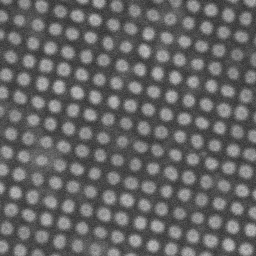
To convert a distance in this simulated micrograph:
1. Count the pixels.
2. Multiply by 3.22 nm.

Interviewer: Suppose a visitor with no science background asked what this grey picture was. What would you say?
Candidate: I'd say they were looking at a regular array of raised bodies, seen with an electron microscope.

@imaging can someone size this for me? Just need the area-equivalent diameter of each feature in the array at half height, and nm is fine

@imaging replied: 34.1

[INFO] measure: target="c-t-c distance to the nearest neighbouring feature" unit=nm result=57.8